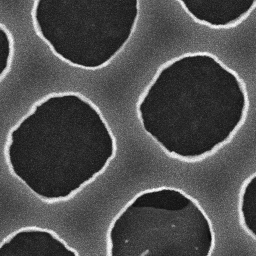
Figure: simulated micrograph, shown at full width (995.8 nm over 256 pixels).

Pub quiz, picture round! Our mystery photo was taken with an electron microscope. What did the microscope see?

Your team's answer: holes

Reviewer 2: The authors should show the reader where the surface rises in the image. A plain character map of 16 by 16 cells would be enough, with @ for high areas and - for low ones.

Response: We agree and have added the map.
@@-------@@@----
@@------@@@@@-@@
@@@-----@@@@@@@@
@@@@---@@@@@-@@@
@@@@@@@@@@----@@
@@@@@@@@@------@
@@@---@@@------@
@@----@@@------@
@------@@@----@@
@------@@@@--@@@
@-----@@@@@@@@@@
@@---@@@@@@@@@@@
@@@@@@@@@---@@@-
@@@@@@@@-----@@-
@--@@@@------@@@
----@@@------@@@